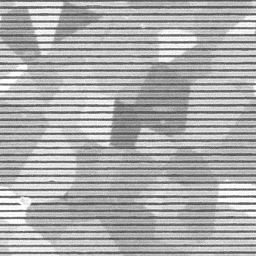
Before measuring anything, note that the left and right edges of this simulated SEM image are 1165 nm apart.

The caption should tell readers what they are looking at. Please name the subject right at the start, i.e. parallel lines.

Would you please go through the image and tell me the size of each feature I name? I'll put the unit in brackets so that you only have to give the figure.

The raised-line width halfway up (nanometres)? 15.9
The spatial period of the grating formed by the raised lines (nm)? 31.9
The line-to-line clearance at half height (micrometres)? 0.0154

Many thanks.